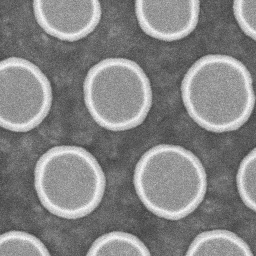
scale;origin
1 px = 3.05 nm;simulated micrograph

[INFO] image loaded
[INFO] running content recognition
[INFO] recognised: raised bodies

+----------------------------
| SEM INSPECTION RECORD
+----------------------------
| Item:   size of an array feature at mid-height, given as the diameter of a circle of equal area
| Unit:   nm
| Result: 204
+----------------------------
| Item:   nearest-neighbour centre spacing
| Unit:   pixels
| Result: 100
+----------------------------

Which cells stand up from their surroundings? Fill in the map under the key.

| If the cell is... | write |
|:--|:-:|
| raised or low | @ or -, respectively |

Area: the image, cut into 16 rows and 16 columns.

--@@@@---@@@---@
---@@@---@@@---@
----------------
----------------
@@----@@@---@@@-
@@@--@@@@---@@@@
@@@---@@@---@@@@
@@----@@@---@@@-
----------------
---@@----@@@----
--@@@@---@@@@--@
--@@@@---@@@@--@
---@@@---@@@---@
----------------
----------------
@@@---@@@---@@@-